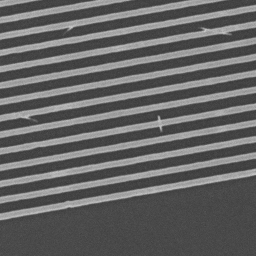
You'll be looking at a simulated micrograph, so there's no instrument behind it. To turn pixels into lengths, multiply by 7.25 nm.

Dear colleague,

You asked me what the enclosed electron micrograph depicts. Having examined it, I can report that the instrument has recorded parallel lines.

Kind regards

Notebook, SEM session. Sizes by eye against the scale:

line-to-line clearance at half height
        0.0741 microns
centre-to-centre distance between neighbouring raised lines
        117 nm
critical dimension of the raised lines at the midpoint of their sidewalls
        40.2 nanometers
